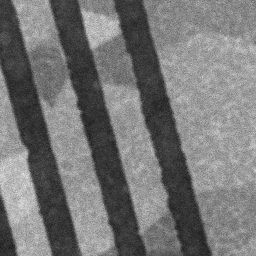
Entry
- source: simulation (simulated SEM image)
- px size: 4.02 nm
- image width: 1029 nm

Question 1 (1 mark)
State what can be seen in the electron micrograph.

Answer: one or a few lines or trenches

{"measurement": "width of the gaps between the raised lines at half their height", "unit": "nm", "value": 117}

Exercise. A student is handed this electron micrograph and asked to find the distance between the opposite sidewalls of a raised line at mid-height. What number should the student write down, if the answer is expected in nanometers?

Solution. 135